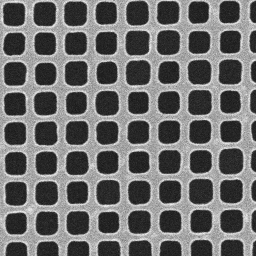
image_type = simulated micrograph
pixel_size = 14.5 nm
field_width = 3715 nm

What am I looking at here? a regular array of holes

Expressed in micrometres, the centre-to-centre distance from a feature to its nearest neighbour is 0.432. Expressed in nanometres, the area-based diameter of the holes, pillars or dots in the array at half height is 359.